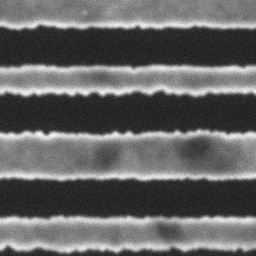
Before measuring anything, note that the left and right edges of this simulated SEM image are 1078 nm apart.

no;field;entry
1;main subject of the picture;lines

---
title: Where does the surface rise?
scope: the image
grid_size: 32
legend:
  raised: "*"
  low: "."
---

********************************
********************************
********************************
.***......*........*.......*****
................................
................................
................................
................................
*******.********.***************
********************************
********************************
*****************.*..***********
................................
................................
................................
................................
...*....................***.....
********************************
********************************
********************************
********************************
********************************
................................
................................
................................
................................
................................
********************************
********************************
********************************
********************************
................................